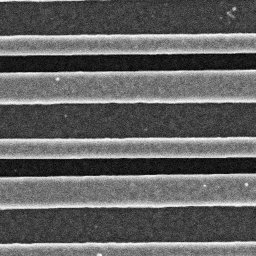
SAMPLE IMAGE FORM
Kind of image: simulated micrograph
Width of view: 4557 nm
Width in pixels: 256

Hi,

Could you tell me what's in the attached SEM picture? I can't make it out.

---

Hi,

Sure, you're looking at lines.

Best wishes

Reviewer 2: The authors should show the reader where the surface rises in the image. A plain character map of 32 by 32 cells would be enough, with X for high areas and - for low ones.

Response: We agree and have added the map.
--------------------------------
--------------------------------
--------------------------------
--------------------------------
----------XXXXXXXXXXXXXXXXXXXXXX
XXXXXXXXXXXXXXXXXXXXXXXXXXXXXXXX
XXXXXXXXXXXXXXXXXXXXXXXXXXXXXX--
--------------------------------
--------------------------------
XXXXXXXXXXXXXXXXXXXXXXXXXXXXXXXX
XXXXXXXXXXXXXXXXXXXXXXXXXXXXXXXX
XXXXXXXXXXXXXXXXXXXXXXXXXXXXXXXX
XXXXXXXXXXXXXXXXXXXXXXXXXXXXXXXX
--------------------------------
--------------------------------
--------------------------------
--------------------------------
-------------XXXXXXXXXXXXXXXXXXX
XXXXXXXXXXXXXXXXXXXXXXXXXXXXXXXX
XXXXXXXXXXXXXXXXXXXXXXXXXXXXXXXX
--------------------------------
--------------------------------
XXXXXXXXXXXXXXXXXXXXXXXXXXXXXXXX
XXXXXXXXXXXXXXXXXXXXXXXXXXXXXXXX
XXXXXXXXXXXXXXXXXXXXXXXXXXXXXXXX
XXXXXXXXXXXXXXXXXXXXXXXXXXXXXXXX
--------------------------------
--------------------------------
--------------------------------
--------------------------------
----------XXXXXXXXXXXXXXXXXXXXXX
XXXXXXXXXXXXXXXXXXXXXXXXXXXXXXXX